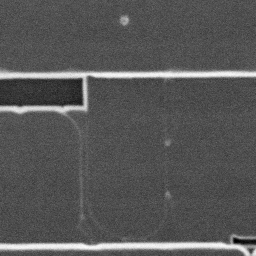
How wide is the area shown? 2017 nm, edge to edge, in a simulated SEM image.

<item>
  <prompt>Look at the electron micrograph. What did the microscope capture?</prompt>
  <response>wiring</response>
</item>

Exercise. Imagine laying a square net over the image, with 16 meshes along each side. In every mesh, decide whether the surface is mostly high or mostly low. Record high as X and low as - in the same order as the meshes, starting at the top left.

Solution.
XXXXXXXXXXXXXXXX
XXXXXXXXXXXXXXXX
XXXXXXXXXXXXXXXX
XXXXXXXXXXXXXXXX
XXXXXXXXXXXXXXXX
----------------
----------------
----------------
----------------
----------------
----------------
----------------
----------------
----------------
----------------
XXXXXXXXXXXXXXX-